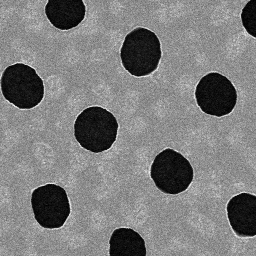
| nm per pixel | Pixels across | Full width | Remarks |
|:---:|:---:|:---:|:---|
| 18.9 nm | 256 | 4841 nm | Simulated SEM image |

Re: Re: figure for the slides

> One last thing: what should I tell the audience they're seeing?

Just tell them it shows holes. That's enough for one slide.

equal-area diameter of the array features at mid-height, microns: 0.815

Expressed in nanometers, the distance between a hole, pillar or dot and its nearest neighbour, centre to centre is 1640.